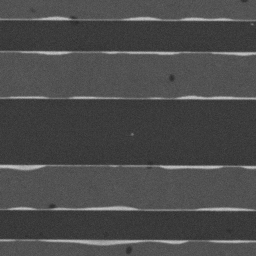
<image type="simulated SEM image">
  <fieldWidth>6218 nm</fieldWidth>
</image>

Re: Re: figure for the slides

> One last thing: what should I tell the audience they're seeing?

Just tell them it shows groups of lines, slits or small figures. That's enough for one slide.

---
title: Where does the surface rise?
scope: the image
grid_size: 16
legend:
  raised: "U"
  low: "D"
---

UUUUUUUUUUUUUUUU
DDDDDDDDDDDDDDDD
DDDDDDDDDDDDDDDD
UUUUUUUUUUUUUUUU
UUUUUUUUUUUUUUUU
UUUUUUUUUUUUUUUU
DDDDDDDDDDDDDDDD
DDDDDDDDDDDDDDDD
DDDDDDDDDDDDDDDD
DDDDDDDDDDDDDDDD
UUUUUUUUUUUUUUUU
UUUUUUUUUUUUUUUU
UUUUUUUUUUUUUUUU
DDDDDDDDDDDDDDDD
DDDDDDDDDDDDDDDD
UUUUUUUUUUUUUUUU